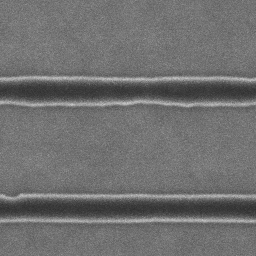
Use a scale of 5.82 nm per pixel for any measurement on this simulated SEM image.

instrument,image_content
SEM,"one or a few lines or trenches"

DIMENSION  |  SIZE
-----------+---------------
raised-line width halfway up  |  153 nm